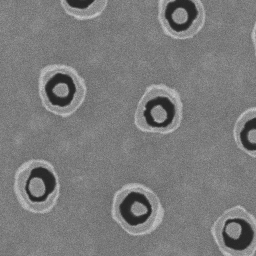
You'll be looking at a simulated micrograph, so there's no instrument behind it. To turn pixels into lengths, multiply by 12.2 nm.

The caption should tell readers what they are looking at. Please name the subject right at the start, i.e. ring-shaped raised bodies with a dot in the middle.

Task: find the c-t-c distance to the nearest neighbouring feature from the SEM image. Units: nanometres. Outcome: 1220